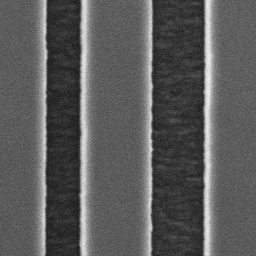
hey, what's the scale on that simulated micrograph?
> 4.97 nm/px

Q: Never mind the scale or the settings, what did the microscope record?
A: lines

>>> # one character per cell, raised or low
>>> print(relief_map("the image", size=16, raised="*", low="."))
***..****....***
***..****....***
***..****....***
***..****....***
***..****....***
***..****....***
***..****....***
***..****....***
***..****....***
***..****....***
***..****....***
***..****....***
***..****....***
***..****....***
***..****....***
***..****....***